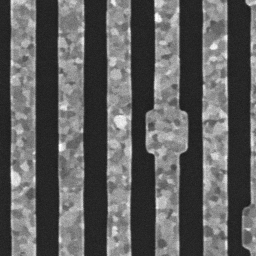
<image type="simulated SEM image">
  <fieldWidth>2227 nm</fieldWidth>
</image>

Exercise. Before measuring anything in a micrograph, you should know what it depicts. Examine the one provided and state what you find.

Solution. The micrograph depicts wiring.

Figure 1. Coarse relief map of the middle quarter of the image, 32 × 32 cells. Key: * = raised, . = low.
*****......******......******...
*****......******......******...
*****......******......******...
*****......******......******...
*****......******......******...
*****......******......******...
*****......******......******...
*****......******......******...
*****......******......******...
*****......******......******...
*****......******......******...
*****......******.....*******...
*****......******....**********.
*****......******....**********.
*****......******....**********.
*****......******....**********.
*****......******....**********.
*****......******....**********.
*****......******....**********.
*****......******....**********.
*****......******....**********.
*****......******....*********..
*****......******.....*******...
*****......******......******...
*****......******......******...
*****......******......******...
*****......******......******...
*****......******......******...
*****......******......******...
*****......******......******...
*****......******......******...
*****......******......******...